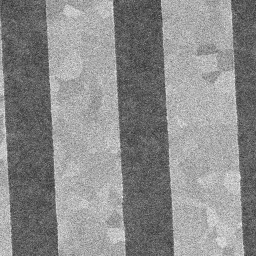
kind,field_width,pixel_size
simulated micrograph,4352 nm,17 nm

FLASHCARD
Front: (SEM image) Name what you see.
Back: one or a few lines or trenches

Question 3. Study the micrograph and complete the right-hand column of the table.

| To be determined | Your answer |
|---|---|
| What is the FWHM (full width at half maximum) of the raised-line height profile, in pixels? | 67.7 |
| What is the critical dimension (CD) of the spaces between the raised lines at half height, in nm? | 826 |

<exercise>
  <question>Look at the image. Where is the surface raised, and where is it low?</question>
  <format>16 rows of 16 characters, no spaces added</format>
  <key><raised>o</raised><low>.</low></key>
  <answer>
...oooo...oooo..
...oooo...oooo..
...oooo...ooooo.
...oooo...ooooo.
...oooo...ooooo.
...oooo...ooooo.
...oooo...ooooo.
...oooo...ooooo.
...oooo....oooo.
...ooooo...oooo.
...ooooo...oooo.
o..ooooo...oooo.
o..ooooo...oooo.
o...oooo...oooo.
o...oooo...oooo.
o...oooo...oooo.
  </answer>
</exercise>